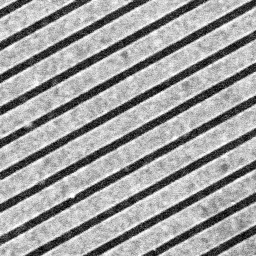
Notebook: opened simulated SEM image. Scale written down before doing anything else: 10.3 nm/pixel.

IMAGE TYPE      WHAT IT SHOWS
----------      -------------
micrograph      parallel lines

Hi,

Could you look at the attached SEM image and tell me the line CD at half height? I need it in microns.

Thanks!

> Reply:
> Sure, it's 0.203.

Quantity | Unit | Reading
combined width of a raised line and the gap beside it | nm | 294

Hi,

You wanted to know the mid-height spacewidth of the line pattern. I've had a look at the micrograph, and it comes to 91.6 nanometres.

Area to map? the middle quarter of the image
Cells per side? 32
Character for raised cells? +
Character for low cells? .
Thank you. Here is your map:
++.....++++++++++.....+++++++++.
.....++++++++++.....++++++++++..
...++++++++++.....++++++++++....
..+++++++++.....++++++++++.....+
+++++++++.....++++++++++.....+++
++++++++.....+++++++++.....+++++
++++++.....++++++++++.....++++++
++++.....++++++++++.....++++++++
++.....++++++++++.....+++++++++.
+....++++++++++.....++++++++++..
....+++++++++.....++++++++++....
..+++++++++.....++++++++++.....+
++++++++++....++++++++++.....+++
++++++++.....++++++++++.....++++
++++++.....++++++++++.....++++++
++++.....++++++++++.....++++++++
++.....++++++++++.....++++++++++
+....++++++++++.....++++++++++..
....++++++++++....++++++++++....
..++++++++++....++++++++++.....+
++++++++++.....++++++++++....+++
++++++++.....++++++++++.....++++
++++++.....++++++++++.....++++++
++++.....++++++++++.....++++++++
+++....++++++++++.....++++++++++
+.....++++++++++....++++++++++..
....++++++++++.+...+++++++++....
..++++++++++.....+++++++++.....+
++++++++++.....++++++++++.....++
++++++++.....++++++++++.....++++
++++++.....++++++++++.....++++++
+++++....++++++++++.....++++++++